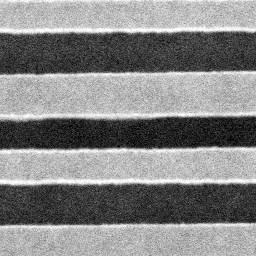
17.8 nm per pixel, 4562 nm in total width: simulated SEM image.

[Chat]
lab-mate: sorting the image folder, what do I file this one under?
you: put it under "lines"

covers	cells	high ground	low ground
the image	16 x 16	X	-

XXXXXXXXXXXXXXXX
XXXXXXXXXXXXXXXX
----------------
----------------
----------------
XXXXXXXXXXXXXXXX
XXXXXXXXXXXXXXXX
----------------
----------------
XXXXXXXXXXXXXXXX
XXXXXXXXXXXXXXXX
----------------
----------------
----------------
XXXXXXXXXXXXXXXX
XXXXXXXXXXXXXXXX